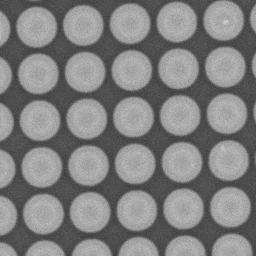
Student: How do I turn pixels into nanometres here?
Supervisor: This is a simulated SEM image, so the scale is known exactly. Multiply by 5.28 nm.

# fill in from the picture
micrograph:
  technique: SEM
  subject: an array of small figures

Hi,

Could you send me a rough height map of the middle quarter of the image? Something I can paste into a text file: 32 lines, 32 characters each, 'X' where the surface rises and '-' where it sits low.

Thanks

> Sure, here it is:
-XXXXXXXXX--XXXXXXXXXX--XXXXXXXX
XXXXXXXXXX--XXXXXXXXXX--XXXXXXXX
XXXXXXXXXX--XXXXXXXXXX--XXXXXXXX
-XXXXXXXXX--XXXXXXXXXX--XXXXXXXX
-XXXXXXXXX---XXXXXXXX----XXXXXXX
--XXXXXXX-----XXXXXX------XXXXX-
---XXXXX--------XX--------------
--------------------------------
----------------XXX--------XXXX-
---XXXXX------XXXXXXX----XXXXXXX
--XXXXXXXX---XXXXXXXX----XXXXXXX
-XXXXXXXXX---XXXXXXXXX--XXXXXXXX
-XXXXXXXXX--XXXXXXXXXX--XXXXXXXX
-XXXXXXXXXX-XXXXXXXXXX--XXXXXXXX
-XXXXXXXXXX--XXXXXXXXX--XXXXXXXX
-XXXXXXXXX---XXXXXXXXX---XXXXXXX
--XXXXXXXX---XXXXXXXX-----XXXXXX
--XXXXXXX------XXXXX-------XXXX-
----XXX-------------------------
--------------------------------
----------------XXXX-------XXXXX
---XXXXXX-----XXXXXXX----XXXXXXX
--XXXXXXXX---XXXXXXXXX---XXXXXXX
--XXXXXXXXX--XXXXXXXXXX--XXXXXXX
-XXXXXXXXXX--XXXXXXXXXX--XXXXXXX
-XXXXXXXXXX--XXXXXXXXXX--XXXXXXX
-XXXXXXXXXX--XXXXXXXXXX--XXXXXXX
--XXXXXXXXX--XXXXXXXXX---XXXXXXX
--XXXXXXXX----XXXXXXX-----XXXXXX
---XXXXXX-------XXXX---------XX-
--------------------------------
----------------------------XXXX